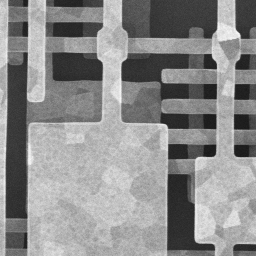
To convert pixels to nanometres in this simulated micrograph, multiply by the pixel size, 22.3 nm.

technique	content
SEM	wiring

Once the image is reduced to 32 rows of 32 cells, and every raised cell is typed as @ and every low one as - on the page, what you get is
@--@@@-------@@------------@@---
@@@@@@@@@@@@@@@------------@@---
@@@@@@@@@@@@@@@------------@@---
@---@@-------@@------------@@---
@--@@@------@@@@-----------@@@--
@@@@@@@@@@@@@@@@@@@@@@@@@@@@@@@@
@--@@@@@@@@@@@@@@@@@@@@@@@@@@@@@
@---@@------@@@@-----------@@@--
@---@@-------@@------------@@@--
@--@@@-------@@-----@@@@@@@@@@@@
@--@@@-------@@------------@@@--
@--@@--------@@------------@@---
@---@--------@@------@@@---@@@--
@------------@@-----@@@@@@@@@@@@
@------------@@------------@@---
@---@@@@@@@@@@@@@@@--------@@---
@---@@@@@@@@@@@@@@@@@@@@@@@@@@@@
@---@@@@@@@@@@@@@@@@@@@@@@@@@@@@
@---@@@@@@@@@@@@@@@@@------@@---
@---@@@@@@@@@@@@@@@@@------@@@--
@---@@@@@@@@@@@@@@@@@@@@@@@@@@@@
@---@@@@@@@@@@@@@@@@@@@@@@@@@@@@
@---@@@@@@@@@@@@@@@@@---@@@@@@@@
@---@@@@@@@@@@@@@@@@@---@@@@@@@@
@---@@@@@@@@@@@@@@@@@---@@@@@@@@
@---@@@@@@@@@@@@@@@@@---@@@@@@@@
@---@@@@@@@@@@@@@@@@@---@@@@@@@@
@@@@@@@@@@@@@@@@@@@@@---@@@@@@@@
@@@@@@@@@@@@@@@@@@@@@---@@@@@@@@
@--@@@@@@@@@@@@@@@@@@---@@@@@@@@
@--@@@@@@@@@@@@@@@@@@-----@@@@--
@@@@@@@@@@@@@@@@@@@@@@@@@@@@@@@@